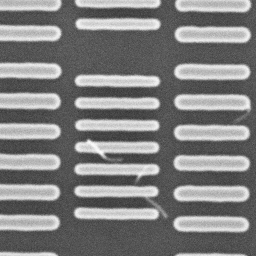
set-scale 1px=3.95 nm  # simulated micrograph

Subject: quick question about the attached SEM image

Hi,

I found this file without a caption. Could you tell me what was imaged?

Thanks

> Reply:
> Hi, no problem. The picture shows groups of lines, slits or small figures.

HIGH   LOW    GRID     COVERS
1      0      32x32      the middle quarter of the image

00000000000000000000000000000111
00000000000000000000000000001111
00000000000000000000000000001111
00011111111111111111111000000111
00011111111111111111111100000000
00000000000111111111111000000000
00000000000000000000000000000000
00000000000000000000000000000000
00000000000000000000000000001111
00011111111111111111111100001111
00011111111111111111111100001111
00000000000000000000000000000000
00000000000000000000000000000000
00000000000000000000000000000000
00011111111111111111111000000000
00011111111111111111111100000111
00000000000000000000000000001111
00000000000000000000000000001111
00000000000000000000000000001111
00000110000000000000000000000000
00011111111111111111111100000000
00011111111111111111111000000000
00000000010000000000000000000000
00000000000000000000000000001111
00000000000000000000000000001111
00011111111111111111111000001111
00011111111111111111111100000111
00001111111111111111111000000000
00000000000000000000000000000000
00000000000000000000000000000000
00000000000000000000000000000000
00011111111111111111111000001111